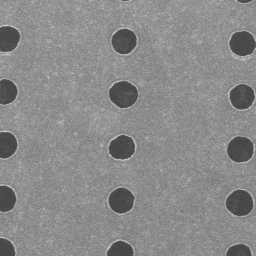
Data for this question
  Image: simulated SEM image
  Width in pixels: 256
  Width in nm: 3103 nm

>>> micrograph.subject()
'holes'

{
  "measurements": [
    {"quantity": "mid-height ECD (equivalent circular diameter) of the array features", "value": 316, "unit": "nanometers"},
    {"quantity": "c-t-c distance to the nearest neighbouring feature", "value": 0.642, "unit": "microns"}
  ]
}